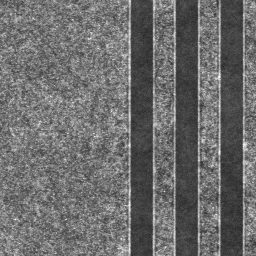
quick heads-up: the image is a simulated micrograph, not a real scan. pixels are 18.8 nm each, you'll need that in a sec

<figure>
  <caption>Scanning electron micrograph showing parallel lines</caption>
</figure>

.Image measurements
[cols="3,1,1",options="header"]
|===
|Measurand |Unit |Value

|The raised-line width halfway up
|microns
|0.395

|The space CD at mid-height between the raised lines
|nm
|458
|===